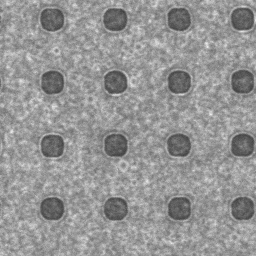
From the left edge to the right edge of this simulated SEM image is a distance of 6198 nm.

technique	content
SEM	a regular array of holes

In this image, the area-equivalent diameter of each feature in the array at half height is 611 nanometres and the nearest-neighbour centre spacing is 1520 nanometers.